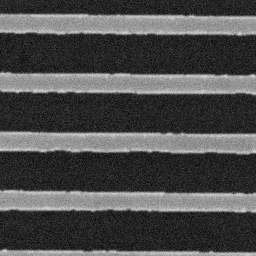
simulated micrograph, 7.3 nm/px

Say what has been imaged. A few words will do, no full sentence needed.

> lines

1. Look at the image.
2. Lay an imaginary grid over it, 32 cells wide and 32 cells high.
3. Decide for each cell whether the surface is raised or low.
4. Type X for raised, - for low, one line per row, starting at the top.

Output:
--------------------------------
--------------------------------
XXXXXXXXXXXXXXXXXXXXXXXXXXXXXXXX
XXXXXXXXXXXXXXXXXXXXXXXXXXXXXXXX
--------------------------------
--------------------------------
--------------------------------
--------------------------------
--------------------------------
XXXXXXXXXXXXXXXXXXXXXXX-XX------
XXXXXXXXXXXXXXXXXXXXXXXXXXXXXXXX
----XX-XX--XXXXXXXXXXXXXXXXXXXXX
--------------------------------
--------------------------------
--------------------------------
--------------------------------
--------------------------------
XXXXXXXXXXXXXXXXXXXXXXXXXXXXXXXX
XXXXXXXXXXXXXXXXXXXXXXXXXXXXXXXX
--------------------------------
--------------------------------
--------------------------------
--------------------------------
--------------------------------
XXXXXXXXXXXXXXXXXXXXXXXXXXXXXXXX
XXXXXXXXXXXXXXXXXXXXXXXXXXXXXXXX
--------------------------------
--------------------------------
--------------------------------
--------------------------------
--------------------------------
XXXXXXXX-X-XX-------------------